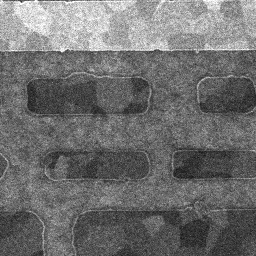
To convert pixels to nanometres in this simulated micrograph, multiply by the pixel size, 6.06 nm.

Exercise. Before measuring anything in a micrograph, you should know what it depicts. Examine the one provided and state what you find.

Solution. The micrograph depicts one or a few lines or trenches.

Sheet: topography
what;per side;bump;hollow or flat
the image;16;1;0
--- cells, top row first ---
1111111111111111
1111111111111111
1111111111111111
0000000000000000
0000000000000000
0011111110001111
0011111110001111
0000000000000000
0000000000000000
0001111110011111
0001111110011111
0000000000000000
0000000000000000
1100011111111111
1110011111111111
1110011111111111